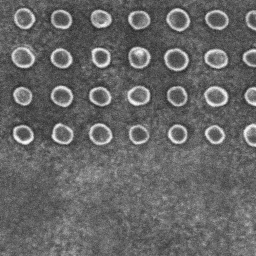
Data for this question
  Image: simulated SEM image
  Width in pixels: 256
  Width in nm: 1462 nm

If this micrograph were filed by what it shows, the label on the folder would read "a regular array of raised bodies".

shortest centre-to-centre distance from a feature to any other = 0.217 microns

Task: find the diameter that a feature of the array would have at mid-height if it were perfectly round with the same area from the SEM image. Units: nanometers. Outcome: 111